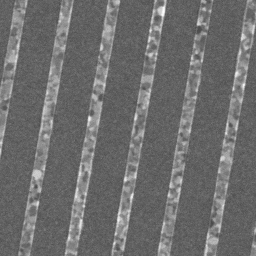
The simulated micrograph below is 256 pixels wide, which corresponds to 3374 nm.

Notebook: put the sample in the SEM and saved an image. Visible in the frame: parallel lines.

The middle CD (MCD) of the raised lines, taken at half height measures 11 px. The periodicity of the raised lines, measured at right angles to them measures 0.603 microns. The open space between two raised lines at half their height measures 458 nanometres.